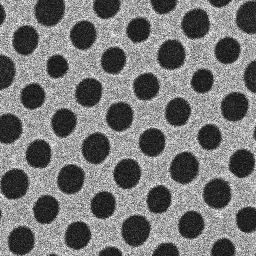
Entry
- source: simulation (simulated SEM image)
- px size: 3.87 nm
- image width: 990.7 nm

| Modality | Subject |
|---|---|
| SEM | a regular array of holes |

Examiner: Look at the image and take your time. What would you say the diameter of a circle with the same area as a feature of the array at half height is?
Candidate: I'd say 0.108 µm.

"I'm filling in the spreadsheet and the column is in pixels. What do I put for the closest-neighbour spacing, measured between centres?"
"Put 39.4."